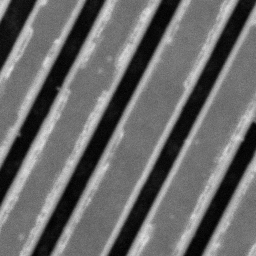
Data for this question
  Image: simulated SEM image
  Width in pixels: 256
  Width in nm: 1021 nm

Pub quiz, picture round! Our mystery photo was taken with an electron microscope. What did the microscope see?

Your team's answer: one or a few lines or trenches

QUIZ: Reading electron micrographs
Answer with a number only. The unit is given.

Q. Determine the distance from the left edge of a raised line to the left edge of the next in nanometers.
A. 268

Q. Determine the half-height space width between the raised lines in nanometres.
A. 93.2